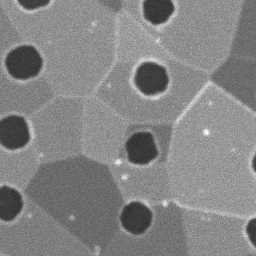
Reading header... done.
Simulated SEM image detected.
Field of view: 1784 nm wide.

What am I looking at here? holes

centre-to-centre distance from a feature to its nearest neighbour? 489 nanometers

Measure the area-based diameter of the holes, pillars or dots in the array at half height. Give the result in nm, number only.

236